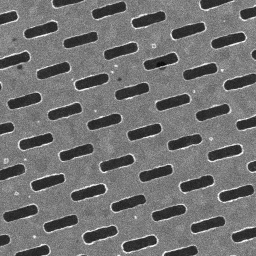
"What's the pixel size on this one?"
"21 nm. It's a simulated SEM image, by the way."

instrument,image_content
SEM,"a regular array of holes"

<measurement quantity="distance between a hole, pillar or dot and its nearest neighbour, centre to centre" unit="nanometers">855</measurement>